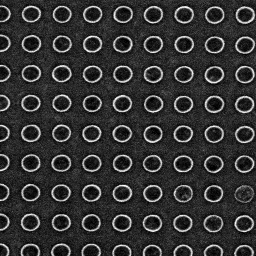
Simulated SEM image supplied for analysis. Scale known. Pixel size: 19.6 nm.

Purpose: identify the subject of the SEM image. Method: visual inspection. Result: a regular array of raised bodies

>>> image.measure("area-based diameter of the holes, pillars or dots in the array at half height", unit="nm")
328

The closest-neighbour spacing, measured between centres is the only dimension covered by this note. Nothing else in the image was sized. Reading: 29.7 pixels